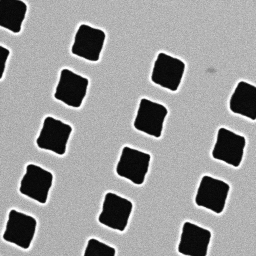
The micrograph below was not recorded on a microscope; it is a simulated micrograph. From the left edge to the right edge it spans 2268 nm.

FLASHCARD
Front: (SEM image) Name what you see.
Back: a regular array of holes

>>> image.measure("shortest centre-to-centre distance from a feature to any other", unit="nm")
436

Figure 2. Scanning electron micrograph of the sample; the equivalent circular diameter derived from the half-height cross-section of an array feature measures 299 nm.